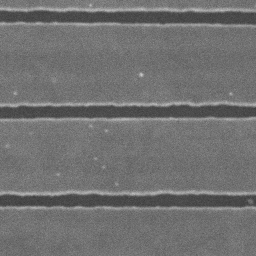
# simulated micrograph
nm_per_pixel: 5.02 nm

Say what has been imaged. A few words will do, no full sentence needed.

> lines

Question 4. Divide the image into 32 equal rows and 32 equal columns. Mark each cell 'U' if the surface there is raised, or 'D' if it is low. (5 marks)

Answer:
UUUUUUUUUUUUUUUUUUUUUUUUUUUUUUUU
DDDDDDDDDDDDDDDDDDDDDDDDDDDDDDDD
DDDDDDDDDDDDDDDDDDDDDDDDDDDDDDDD
UUUUUUUUUUUUUUUUUUUUUUUUUUUUUUUU
UUUUUUUUUUUUUUUUUUUUUUUUUUUUUUUU
UUUUUUUUUUUUUUUUUUUUUUUUUUUUUUUU
UUUUUUUUUUUUUUUUUUUUUUUUUUUUUUUU
UUUUUUUUUUUUUUUUUUUUUUUUUUUUUUUU
UUUUUUUUUUUUUUUUUUUUUUUUUUUUUUUU
UUUUUUUUUUUUUUUUUUUUUUUUUUUUUUUU
UUUUUUUUUUUUUUUUUUUUUUUUUUUUUUUU
UUUUUUUUUUUUUUUUUUUUUUUUUUUUUUUU
UUUUUUUUUUUUUUUUUUUUUUUUUUUUUUUU
DDDDDDDDDDDDDDDDDDDDDDDDDDDDDDDD
DDDDDDDDDDDDDDDDDDDDDDDDDDDDDDDD
UUUUUUUUUUUUUUUUUUUUUUUUUUUUUUUU
UUUUUUUUUUUUUUUUUUUUUUUUUUUUUUUU
UUUUUUUUUUUUUUUUUUUUUUUUUUUUUUUU
UUUUUUUUUUUUUUUUUUUUUUUUUUUUUUUU
UUUUUUUUUUUUUUUUUUUUUUUUUUUUUUUU
UUUUUUUUUUUUUUUUUUUUUUUUUUUUUUUU
UUUUUUUUUUUUUUUUUUUUUUUUUUUUUUUU
UUUUUUUUUUUUUUUUUUUUUUUUUUUUUUUU
UUUUUUUUUUUUUUUUUUUUUUUUUUUUUUUU
DDDDDDDDDDDDDDDDDDDDDDDDDDDDDDDD
DDDDDDDDDDDDDDDDDDDDDDDDDDDDDDDD
UUUUUUUUUUUUUUUUUUUUUUUUUUUUUUUU
UUUUUUUUUUUUUUUUUUUUUUUUUUUUUUUU
UUUUUUUUUUUUUUUUUUUUUUUUUUUUUUUU
UUUUUUUUUUUUUUUUUUUUUUUUUUUUUUUU
UUUUUUUUUUUUUUUUUUUUUUUUUUUUUUUU
UUUUUUUUUUUUUUUUUUUUUUUUUUUUUUUU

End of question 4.